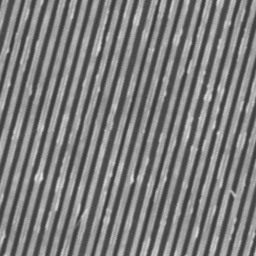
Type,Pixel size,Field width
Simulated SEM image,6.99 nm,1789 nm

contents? parallel lines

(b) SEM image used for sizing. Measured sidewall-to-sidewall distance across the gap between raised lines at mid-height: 34.6 nm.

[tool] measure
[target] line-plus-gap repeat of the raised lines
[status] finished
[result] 76.7 nm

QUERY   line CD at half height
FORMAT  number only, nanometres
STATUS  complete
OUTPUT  41.5